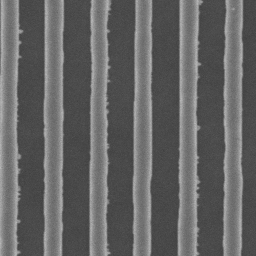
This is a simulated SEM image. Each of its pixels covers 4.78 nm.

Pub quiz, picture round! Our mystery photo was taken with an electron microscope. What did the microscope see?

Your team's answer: lines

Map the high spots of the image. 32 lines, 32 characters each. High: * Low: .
**....**...***...**....**...**..
**....**...***...**....**...**..
**....**...**....**....**...**..
**....**...**....**....**...**..
**....**...**....**....**...**..
**....**...**....**....**...**..
**....**...**....**....**...**..
**....**...***...**....**...**..
**....**...**....**....**...**..
**....**...**....**....**...**..
**....**...**....**....**...**..
**....**...**....**....**...**..
**....**...**....**....**...**..
**....**...**....**....**...**..
**....**...**....**....*....**..
**....**...**....**....**...**..
**....**...**....**....**...**..
**....**...**....**....**...**..
**....**...**....**....**...**..
**....**...**....**....**...**..
**....**...**....**...***...**..
**....**...**....**...***...**..
**....**...**....**...***...**..
**....**...**....**....**...**..
**....**...**....**....**...**..
**....**...**....**....**...**..
**....**...**....**...***...**..
**....**...**....**...***...**..
**....**...**....**...***...**..
**....**...**....**...***...**..
**....**...**....**...***...**..
**....**...**....**...***...**..